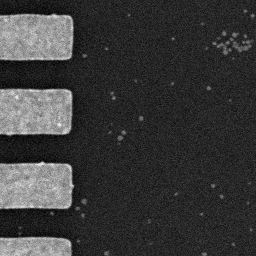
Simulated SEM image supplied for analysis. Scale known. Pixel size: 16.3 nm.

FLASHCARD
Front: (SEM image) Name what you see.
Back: wiring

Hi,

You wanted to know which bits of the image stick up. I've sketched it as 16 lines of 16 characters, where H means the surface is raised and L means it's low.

LLLLLLLLLLLLLLLL
HHHHHLLLLLLLLLLL
HHHHHLLLLLLLLLLL
HHHHLLLLLLLLLLLL
LLLLLLLLLLLLLLLL
LLLLLLLLLLLLLLLL
HHHHLLLLLLLLLLLL
HHHHLLLLLLLLLLLL
LLLLLLLLLLLLLLLL
LLLLLLLLLLLLLLLL
HHHHLLLLLLLLLLLL
HHHHHLLLLLLLLLLL
HHHHLLLLLLLLLLLL
LLLLLLLLLLLLLLLL
LLLLLLLLLLLLLLLL
HHHHLLLLLLLLLLLL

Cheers